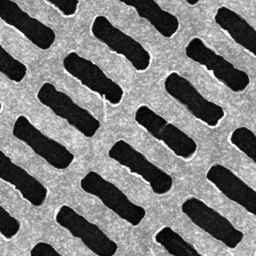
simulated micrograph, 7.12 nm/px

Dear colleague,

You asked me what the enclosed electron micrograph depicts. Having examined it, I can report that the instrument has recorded a regular array of holes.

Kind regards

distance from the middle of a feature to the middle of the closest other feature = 301 nm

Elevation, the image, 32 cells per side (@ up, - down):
--@@@@@---@@@@@@----@@@@@@@@@@@@
---@@@@@-@@@@@@@@----@@@@@@--@@@
-----@@@@@@@--@@@@----@@@@@----@
@@----@@@@@@--@@@@@---@@@@@@----
@@@----@@@@@----@@@@-@@@@@@@@---
@@@@---@@@@@@----@@@@@@@-@@@@@--
-@@@@@@@@@@@@@----@@@@@----@@@@-
--@@@@@@---@@@@@---@@@@@----@@@@
---@@@@@----@@@@@-@@@@@@@@---@@@
@--@@@@@@----@@@@@@@@--@@@@----@
@@@@@@@@@@-----@@@@@@---@@@@---@
@@@@@---@@@@---@@@@@@----@@@@@@@
@@@@@----@@@@--@@@@@@@----@@@@@@
@@@@@@----@@@@@@@--@@@@-----@@@@
@@@@@@@-----@@@@@---@@@@----@@@@
@@--@@@@@---@@@@@----@@@@@-@@@@@
@@---@@@@@--@@@@@@@----@@@@@@--@
@@@----@@@@@@@@@@@@@----@@@@@---
@@@@----@@@@@@---@@@@---@@@@@@--
-@@@@----@@@@@----@@@@--@@@@@@@-
--@@@@---@@@@@@----@@@@@@@@@@@@@
---@@@@@@@@-@@@@@----@@@@@---@@@
-----@@@@@---@@@@@---@@@@@----@@
@@----@@@@-----@@@@--@@@@@@----@
@@@---@@@@@@----@@@@@@@@@@@@----
@@@@-@@@@@@@@----@@@@@@---@@@@--
-@@@@@@--@@@@@----@@@@@----@@@@-
--@@@@@----@@@@@--@@@@@@----@@@@
--@@@@@@----@@@@@@@@-@@@@----@@@
--@@@@@@@----@@@@@@----@@@----@@
@@@@@-@@@@----@@@@@@----@@@@--@@
@@@@---@@@@@--@@@@@@@----@@@@@@@